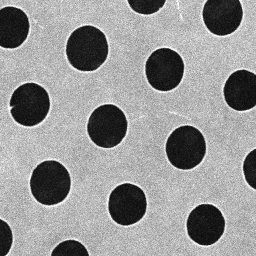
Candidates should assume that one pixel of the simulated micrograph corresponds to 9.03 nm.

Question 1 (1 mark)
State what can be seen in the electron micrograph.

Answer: a regular array of holes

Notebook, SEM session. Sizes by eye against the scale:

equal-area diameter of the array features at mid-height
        378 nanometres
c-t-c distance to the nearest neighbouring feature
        722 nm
